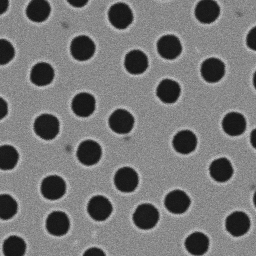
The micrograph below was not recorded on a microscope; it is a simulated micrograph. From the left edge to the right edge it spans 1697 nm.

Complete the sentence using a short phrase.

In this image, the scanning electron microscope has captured a regular array of holes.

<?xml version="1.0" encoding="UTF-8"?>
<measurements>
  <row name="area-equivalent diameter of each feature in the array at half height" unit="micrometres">0.168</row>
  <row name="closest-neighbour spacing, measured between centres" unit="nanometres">284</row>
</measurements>